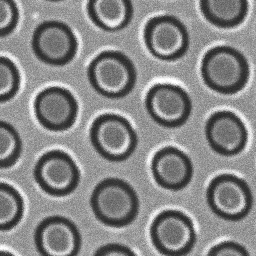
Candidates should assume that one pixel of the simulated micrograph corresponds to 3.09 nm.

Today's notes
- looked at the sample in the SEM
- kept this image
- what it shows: a regular array of ring-shaped grooves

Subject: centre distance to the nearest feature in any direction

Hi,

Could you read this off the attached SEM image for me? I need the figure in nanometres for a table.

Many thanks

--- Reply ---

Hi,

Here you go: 196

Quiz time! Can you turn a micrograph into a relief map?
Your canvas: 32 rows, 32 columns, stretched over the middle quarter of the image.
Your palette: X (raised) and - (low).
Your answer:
XXXXXX--XXXXXXX---XXXXXXXXXXXXXX
XXXXXX--XXXXXXX---XXXXXXXXXXXXXX
XXXXXX--XXXXXXXX--XXXXXXXXXXXXXX
XXXXXX--XXXXXXXX--XXXXXXXXXXXXXX
XXXXXX---XXXXXX---XXXXXXXXXXXXXX
XXXXXXX--XXXXXX---XXXX-------XXX
-XXXXXXX---XXX---XXXX---XX----XX
--XXXXXXX-------XXXXX--XXXXX---X
---XXXXXXXX----XXXXX---XXXXXX---
X--XXXXXXXXXXXXXXXXX--XXXXXXXX--
X---XXXXXXXXXXXXXXXX--XXXXXXXX--
X---XXXXXXXXXXXXXXXXX--XXXXXXX--
X--XXXXXXX----XXXXXXX--XXXXXX---
X--XXXXX--------XXXXXX---XXX---X
---XXXX----XX----XXXXXX--------X
--XXXXX--XXXXXX--XXXXXXXX-----XX
-XXXXX---XXXXXX---XXXXXXXXXXXXXX
XXXXXX---XXXXXXX--XXXXXXXXXXXXXX
XXXXXX---XXXXXXX---XXXXXXXXXXXXX
XXXXXXX--XXXXXXX---XXXXXXXXXXXXX
XXXXXXX---XXXXXX--XXXXXXX---XXXX
XXXXXXXX---XXXX---XXXXXX-----XXX
-XXXXXXXX--------XXXXXX--------X
--XXXXXXXX------XXXXXX---XXXX--X
---XXXXXXXXX--XXXXXXXX--XXXXXX--
X--XXXXXXXXXXXXXXXXXXX--XXXXXX--
XX--XXXXXXXXXXXXXXXXXX--XXXXXX--
XX--XXXXXXXXXXXXXXXXXX--XXXXXX--
XX--XXXXXX----XXXXXXXX---XXXXX--
X---XXXXX-------XXXXXXX---XX----
---XXXXX---------XXXXXXX-------X
---XXXX---XXXX----XXXXXXXX---XXX